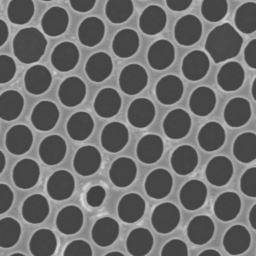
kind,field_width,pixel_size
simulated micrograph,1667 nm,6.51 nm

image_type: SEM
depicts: a regular array of holes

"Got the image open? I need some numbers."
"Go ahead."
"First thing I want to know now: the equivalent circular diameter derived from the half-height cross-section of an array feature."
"186 nanometres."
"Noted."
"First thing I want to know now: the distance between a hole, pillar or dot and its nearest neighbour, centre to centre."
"228 nm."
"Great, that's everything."